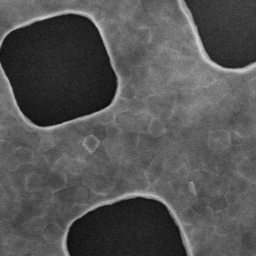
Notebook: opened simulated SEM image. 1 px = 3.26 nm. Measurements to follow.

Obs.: holes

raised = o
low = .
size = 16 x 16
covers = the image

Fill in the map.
oooooooooooo....
oo....oooooo....
......oooooo....
.......oooooo...
.......ooooooooo
o......ooooooooo
o......ooooooooo
oo...ooooooooooo
oooooooooooooooo
oooooooooooooooo
oooooooooooooooo
oooooooooooooooo
oooooooo..oooooo
ooooo......ooooo
oooo.......ooooo
oooo........oooo